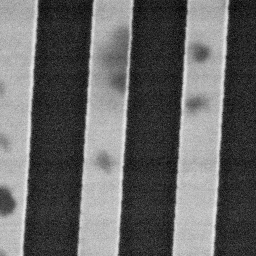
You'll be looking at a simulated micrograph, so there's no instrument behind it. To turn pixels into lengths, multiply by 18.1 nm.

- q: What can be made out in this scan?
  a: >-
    lines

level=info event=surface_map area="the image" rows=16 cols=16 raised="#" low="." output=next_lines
##....##....##..
##....##....##..
##....##....##..
##....##....##..
##....##....##..
##....##...###..
##....##...###..
##...###...###..
##...###...###..
##...###...###..
##...###...###..
##...###...###..
##...###...###..
##...##....##...
#....##....##...
#....##....##...